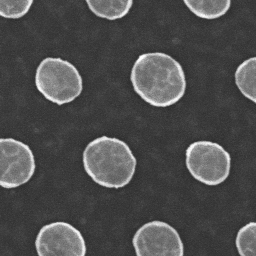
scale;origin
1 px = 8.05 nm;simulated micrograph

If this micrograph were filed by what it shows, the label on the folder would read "raised bodies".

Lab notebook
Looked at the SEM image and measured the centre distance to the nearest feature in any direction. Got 772 nm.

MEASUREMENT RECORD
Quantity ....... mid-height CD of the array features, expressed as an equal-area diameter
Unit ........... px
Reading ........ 47.3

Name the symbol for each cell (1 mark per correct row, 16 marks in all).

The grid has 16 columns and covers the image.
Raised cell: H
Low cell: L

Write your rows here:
HHLLLLHHLLLLHHLL
LLLLLLLLLLLLLLLL
LLLLLLLLLLLLLLLL
LLLLLLLLLHLLLLLL
LLHHHLLLHHHLLLLH
LLHHHLLLHHHLLLLH
LLLLLLLLLLHLLLLL
LLLLLLLLLLLLLLLL
LLLLLLLLLLLLLLLL
HHLLLHHHLLLLHHLL
HHLLLHHHLLLLHHLL
HLLLLLHHLLLLLLLL
LLLLLLLLLLLLLLLL
LLLLLLLLLLLLLLLL
LLLHHLLLLHHLLLLH
LLHHHLLLHHHLLLLH